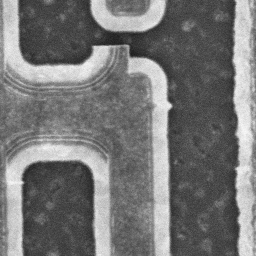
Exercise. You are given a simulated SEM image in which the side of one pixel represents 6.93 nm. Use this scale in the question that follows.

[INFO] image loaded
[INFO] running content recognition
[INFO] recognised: one or a few lines or trenches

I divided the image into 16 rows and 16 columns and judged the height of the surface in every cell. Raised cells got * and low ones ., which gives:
*.....****.....*
*......**......*
*..............*
*.....**.......*
**...*****.....*
**********.....*
**********.....*
**********.....*
**********.....*
**********.....*
*.....****.....*
*.....****.....*
*.....****.....*
*.....****.....*
*.....****.....*
*.....****.....*